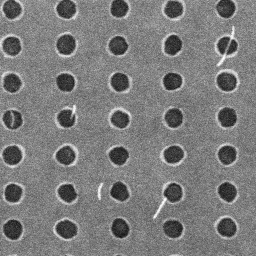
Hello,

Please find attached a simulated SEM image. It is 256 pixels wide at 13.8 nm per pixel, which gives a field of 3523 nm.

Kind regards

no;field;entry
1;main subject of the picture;a regular array of holes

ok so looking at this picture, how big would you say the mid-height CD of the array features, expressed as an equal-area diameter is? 20.5 pixels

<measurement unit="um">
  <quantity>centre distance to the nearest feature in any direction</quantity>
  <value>0.498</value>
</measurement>